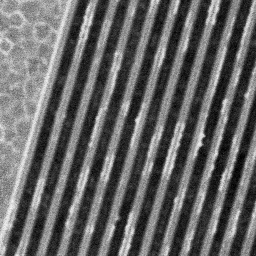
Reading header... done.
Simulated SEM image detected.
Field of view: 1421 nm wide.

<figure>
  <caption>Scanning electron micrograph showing parallel lines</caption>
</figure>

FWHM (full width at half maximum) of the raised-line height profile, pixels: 7.8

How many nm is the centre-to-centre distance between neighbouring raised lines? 109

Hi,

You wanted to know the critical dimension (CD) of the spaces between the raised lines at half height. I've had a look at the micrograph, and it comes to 64.7 nanometers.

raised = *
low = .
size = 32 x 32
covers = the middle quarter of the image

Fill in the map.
..**...**...**...**...**...**...
.**...**...***...**...**...**...
.**...**...**....**...**...**...
.**...**...**...**...**...**...*
***...**...**...**...**...**...*
**...**....**...**...**...**...*
**...**...**...**...**....**...*
**...**...**...**...**...**...**
**..***...*....**...**...**...**
*...**...**....**...**...**...**
*...**...**...**...**...**...**.
....**...**...**...**...**...**.
...**....*....**...**...**...**.
...**...**...**...**....**...**.
...**...**...**...**...**...**..
...**...**...**...**...**...**..
..**...**...**....**...**...**..
..**...**...**...**...**...**...
..*....**...**...**...**...**...
.**....*....**...**...**...**...
.**...**...**...**....**...**...
.**...**...**...**...**...**...*
**...***...**...**...**...**...*
**...**...**....**...**...**...*
**...**...**...**...**...**....*
**...**...**...**...**...**...**
*...**....**...**...**...**...**
*...**...**...**...**....**...**
*...**...**...**...**...**...**.
*..**....**...**...**...**...**.
...**...**....**...**...**...**.
...**...**...**...**...**....**.